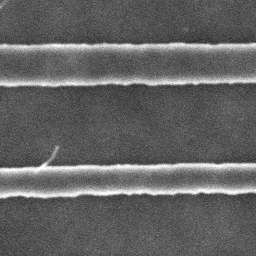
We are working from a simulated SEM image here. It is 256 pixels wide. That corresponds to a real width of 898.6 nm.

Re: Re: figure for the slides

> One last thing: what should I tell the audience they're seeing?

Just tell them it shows lines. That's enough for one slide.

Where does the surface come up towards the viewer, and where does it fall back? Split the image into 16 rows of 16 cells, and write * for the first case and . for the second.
................
................
................
****************
****************
................
................
................
................
................
.***************
****************
................
................
................
................